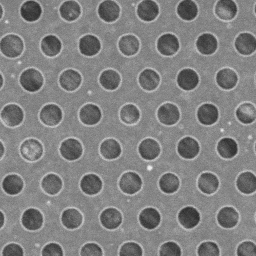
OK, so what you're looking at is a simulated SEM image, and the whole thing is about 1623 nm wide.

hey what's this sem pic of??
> a regular array of holes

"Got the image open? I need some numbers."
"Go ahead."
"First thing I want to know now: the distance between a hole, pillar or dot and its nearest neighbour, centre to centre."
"246 nm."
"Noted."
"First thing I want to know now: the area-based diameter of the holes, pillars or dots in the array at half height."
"142 nanometers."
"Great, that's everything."